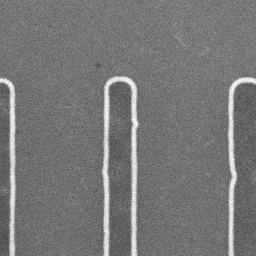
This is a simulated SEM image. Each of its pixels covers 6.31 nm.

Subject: one or a few lines or trenches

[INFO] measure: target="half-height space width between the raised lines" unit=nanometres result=604